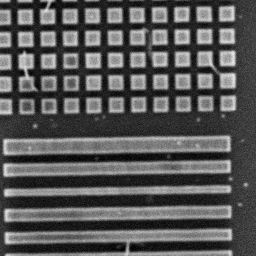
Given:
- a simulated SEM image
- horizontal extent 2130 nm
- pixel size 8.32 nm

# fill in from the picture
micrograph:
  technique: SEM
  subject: groups of lines, slits or small figures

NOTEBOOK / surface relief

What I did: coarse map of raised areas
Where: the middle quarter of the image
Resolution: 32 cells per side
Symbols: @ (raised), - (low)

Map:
@@@---@@@--@@@---@@@------------
--------------------------------
--------------------------------
@@@---@@@--@@@@--@@@---@@@--@@@-
@@@---@@@--@@@@--@@@---@@@--@@@-
@@@---@@@--@@@@--@@@---@@@--@@@-
--------------------------------
--------------------------------
------------------@@----@@--@@@-
@@@---@@@--@@@@--@@@---@@@--@@@-
@@@---@@@--@@@@--@@@---@@@--@@@-
@@@---@@@---@@@--@@@---@@@--@@@-
--------------------------------
--------------------------------
--------------------------------
--------------------------------
--------------------------------
--------------------------------
------------------@@@@@@@@@@@@@@
@@@@@@@@@@@@@@@@@@@@@@@@@@@@@@@@
@@@@@@@@@@@@@@@@@@@@@@@@@@@@@@@@
@@@@@@@@@@@@@@@@@@@@@@@@@@@@@@@@
--------------------------------
--------------------------------
--------------------------------
@@@@@@@@@@@@@@@@@@@@@@@@@@@@@@@@
@@@@@@@@@@@@@@@@@@@@@@@@@@@@@@@@
@@@@@@--------------------------
--------------------------------
--------------------------------
--------------------------------
@@@@@@@@@@@@@@@@@@@@@@@@@@@@@@@@